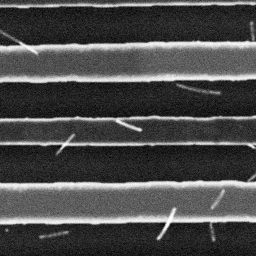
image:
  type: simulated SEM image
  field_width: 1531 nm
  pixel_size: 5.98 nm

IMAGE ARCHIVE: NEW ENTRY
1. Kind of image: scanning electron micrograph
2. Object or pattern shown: lines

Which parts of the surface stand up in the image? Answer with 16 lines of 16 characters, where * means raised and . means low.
................
................
................
****************
****************
................
................
****************
****************
................
................
...*************
****************
****************
................
................